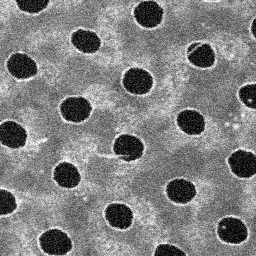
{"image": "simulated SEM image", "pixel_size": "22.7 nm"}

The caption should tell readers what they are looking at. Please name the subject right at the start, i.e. a regular array of holes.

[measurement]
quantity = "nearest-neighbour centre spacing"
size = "1480 nanometers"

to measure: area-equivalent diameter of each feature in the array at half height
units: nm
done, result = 648